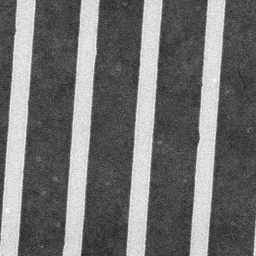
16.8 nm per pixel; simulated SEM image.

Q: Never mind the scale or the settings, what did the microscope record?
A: parallel lines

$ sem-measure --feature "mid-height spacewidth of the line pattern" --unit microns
0.265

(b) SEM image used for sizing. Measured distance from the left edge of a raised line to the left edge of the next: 1.06 microns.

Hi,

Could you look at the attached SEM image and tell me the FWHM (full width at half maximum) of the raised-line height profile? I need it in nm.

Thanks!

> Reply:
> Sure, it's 798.